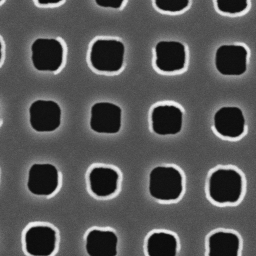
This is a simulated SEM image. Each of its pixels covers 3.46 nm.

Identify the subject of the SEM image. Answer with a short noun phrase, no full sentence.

a regular array of holes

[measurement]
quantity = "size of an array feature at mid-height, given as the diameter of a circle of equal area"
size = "111 nm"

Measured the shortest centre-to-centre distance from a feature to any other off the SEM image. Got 211 nanometers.